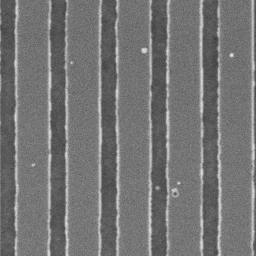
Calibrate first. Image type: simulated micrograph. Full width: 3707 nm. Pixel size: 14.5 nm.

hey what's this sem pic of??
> lines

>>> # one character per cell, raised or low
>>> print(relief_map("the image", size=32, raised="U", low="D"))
DDUUUUDDUUUUUDDUUUUDDUUUUDDUUUUU
DDUUUUDDUUUUUDDUUUUDDUUUUDDUUUUU
DDUUUUDDUUUUUDDUUUUDDUUUUDDUUUUU
DDUUUUDDUUUUUDDUUUUDDUUUUDDUUUUU
DDUUUUDDUUUUDDDUUUUDDUUUUDDUUUUU
DDUUUUDDUUUUDDDUUUUDDUUUUDDUUUUU
DDUUUUDDUUUUDDDUUUUDDUUUUDDUUUUU
DDUUUUDDUUUUDDDUUUUDDUUUUDDUUUUU
DDUUUUDDUUUUDDDUUUUDDUUUUDDUUUUU
DDUUUUDDUUUUDDDUUUUDDUUUUDDUUUUU
DDUUUUDDUUUUUDDUUUUDDUUUUDDUUUUU
DDUUUUDDUUUUDDDUUUUDDUUUUDDUUUUU
DDUUUUDDUUUUDDDUUUUDDUUUUDDUUUUU
DDUUUUDDUUUUDDDUUUUDDUUUUDDUUUUU
DDUUUUDDUUUUUDDUUUUDDUUUUDDUUUUU
DDUUUUDDUUUUUDDUUUUDDUUUUDDUUUUU
DDUUUUDDUUUUUDDUUUUDDUUUUDDUUUUU
DDUUUUDDUUUUUDDUUUUDDUUUUDDUUUUU
DDUUUUDDUUUUUDDUUUUDDUUUUDDUUUUU
DDUUUUDDUUUUDDDUUUUDDUUUUDDUUUUU
DDUUUUDDUUUUDDDUUUUDDUUUUDDUUUUU
DDUUUUDDUUUUUDDUUUUDDUUUUDDUUUUU
DDUUUUDDUUUUDDDUUUUDDUUUUDDUUUUU
DDUUUUDDUUUUDDDUUUUDDUUUUDDUUUUU
DDUUUUDDUUUUDDDUUUUDDUUUUDDUUUUU
DDUUUUDDUUUUUDDUUUUDDUUUUDDUUUUU
DDUUUUDDUUUUUDDUUUUDDUUUUDDUUUUU
DDUUUUDDUUUUDDDUUUUDDUUUUDDDUUUU
DDUUUUDDUUUUDDDUUUUDDUUUUDDUUUUU
DDUUUUDDUUUUUDDUUUUDDUUUUDDUUUUU
DDUUUUDDUUUUUDDUUUUDDUUUUDDUUUUU
DDUUUUDDUUUUDDDUUUUDDUUUUDDUUUUU